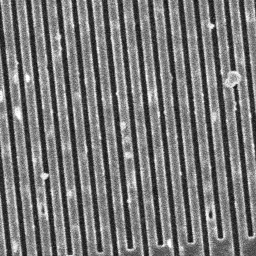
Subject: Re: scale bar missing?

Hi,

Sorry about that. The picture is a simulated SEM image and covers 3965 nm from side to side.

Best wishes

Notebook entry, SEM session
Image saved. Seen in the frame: parallel lines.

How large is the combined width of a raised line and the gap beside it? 0.234 µm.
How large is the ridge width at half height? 146 nm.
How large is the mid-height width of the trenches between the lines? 92.4 nm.